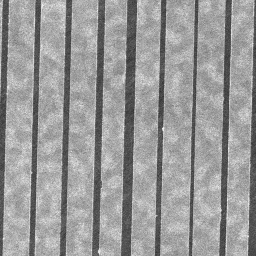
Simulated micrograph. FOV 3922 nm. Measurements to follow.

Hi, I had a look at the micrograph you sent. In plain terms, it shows parallel lines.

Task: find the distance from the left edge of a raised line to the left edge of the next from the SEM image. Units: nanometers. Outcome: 483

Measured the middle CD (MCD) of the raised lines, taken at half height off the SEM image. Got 369 nm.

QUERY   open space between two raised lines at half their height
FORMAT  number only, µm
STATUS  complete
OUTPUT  0.101